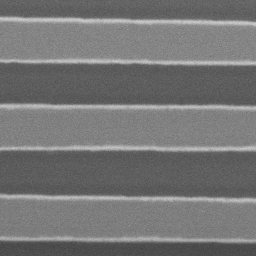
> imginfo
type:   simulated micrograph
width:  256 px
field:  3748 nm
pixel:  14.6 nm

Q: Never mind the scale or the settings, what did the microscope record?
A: lines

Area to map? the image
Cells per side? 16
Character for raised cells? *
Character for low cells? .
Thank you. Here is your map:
................
****************
****************
****************
................
................
................
****************
****************
................
................
................
****************
****************
****************
................